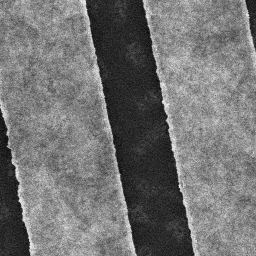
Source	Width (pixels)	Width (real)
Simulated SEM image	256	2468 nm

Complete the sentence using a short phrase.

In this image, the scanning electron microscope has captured one or a few lines or trenches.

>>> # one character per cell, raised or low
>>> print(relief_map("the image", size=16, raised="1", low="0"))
1111100001111110
1111110001111111
1111110000111111
1111110000111111
1111110000111111
1111110000111111
1111111000111111
1111111000011111
0111111000011111
0111111000011111
0111111000011111
0111111100011111
0111111100001111
0011111100001111
0011111100001111
0011111100001111